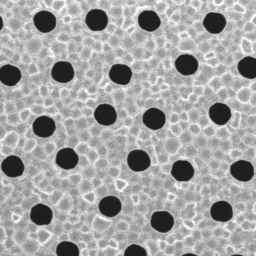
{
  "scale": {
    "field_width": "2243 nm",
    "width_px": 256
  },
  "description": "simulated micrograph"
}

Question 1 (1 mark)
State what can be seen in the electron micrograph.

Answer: a regular array of holes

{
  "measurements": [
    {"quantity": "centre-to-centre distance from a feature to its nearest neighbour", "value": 442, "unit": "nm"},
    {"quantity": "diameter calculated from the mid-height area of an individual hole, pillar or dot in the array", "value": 196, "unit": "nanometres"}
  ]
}